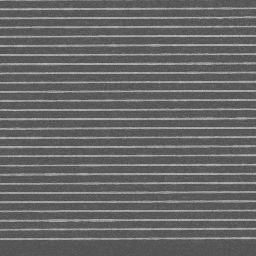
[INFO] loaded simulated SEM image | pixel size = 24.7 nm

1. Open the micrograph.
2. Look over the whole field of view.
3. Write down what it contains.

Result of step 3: parallel lines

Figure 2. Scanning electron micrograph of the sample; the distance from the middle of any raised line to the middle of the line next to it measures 9.19 pixels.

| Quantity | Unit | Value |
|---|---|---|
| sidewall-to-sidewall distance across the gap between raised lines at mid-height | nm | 198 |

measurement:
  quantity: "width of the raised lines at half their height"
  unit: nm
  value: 37.1